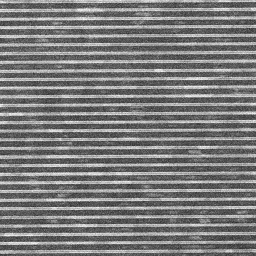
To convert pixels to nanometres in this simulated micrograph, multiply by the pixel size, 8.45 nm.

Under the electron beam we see parallel lines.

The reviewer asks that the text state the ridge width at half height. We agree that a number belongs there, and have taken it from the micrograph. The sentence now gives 0.0179 micrometres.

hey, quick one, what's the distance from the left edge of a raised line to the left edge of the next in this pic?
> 72.8 nm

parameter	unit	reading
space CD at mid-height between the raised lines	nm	58.1